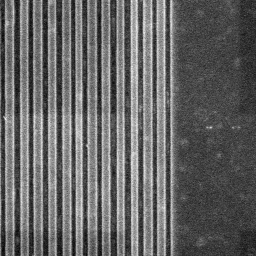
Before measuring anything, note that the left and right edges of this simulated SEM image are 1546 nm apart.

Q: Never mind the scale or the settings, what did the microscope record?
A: parallel lines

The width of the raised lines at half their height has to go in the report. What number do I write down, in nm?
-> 46.8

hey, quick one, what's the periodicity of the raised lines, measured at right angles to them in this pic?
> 13.7 px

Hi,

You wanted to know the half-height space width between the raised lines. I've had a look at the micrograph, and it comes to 0.0362 microns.